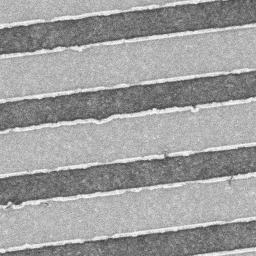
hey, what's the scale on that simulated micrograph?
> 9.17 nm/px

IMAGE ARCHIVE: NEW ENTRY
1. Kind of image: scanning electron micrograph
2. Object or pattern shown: one or a few lines or trenches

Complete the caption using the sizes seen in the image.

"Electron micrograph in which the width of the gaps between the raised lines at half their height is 0.248 micrometres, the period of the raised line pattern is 681 nanometers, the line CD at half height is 46.8 px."